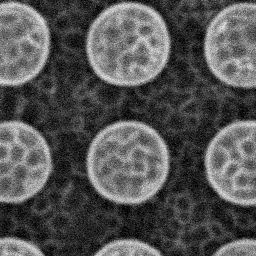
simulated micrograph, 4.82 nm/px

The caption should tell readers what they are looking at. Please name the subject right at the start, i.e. raised bodies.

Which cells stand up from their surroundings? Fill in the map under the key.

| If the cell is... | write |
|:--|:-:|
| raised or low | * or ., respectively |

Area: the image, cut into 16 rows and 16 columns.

**.....**.....**
***...****...***
***..*****...***
***...****...***
**....****...***
................
................
................
***...****....**
***...****...***
***...****...***
***...****...***
*......**.....**
................
................
**.....**.....**